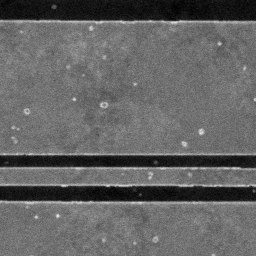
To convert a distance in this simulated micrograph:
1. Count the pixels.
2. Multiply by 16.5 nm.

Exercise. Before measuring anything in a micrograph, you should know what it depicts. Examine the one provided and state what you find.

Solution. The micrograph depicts lines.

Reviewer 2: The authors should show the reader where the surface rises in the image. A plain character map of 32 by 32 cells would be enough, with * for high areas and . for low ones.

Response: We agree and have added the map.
................................
................................
................................
********************************
********************************
********************************
********************************
********************************
********************************
********************************
********************************
********************************
********************************
********************************
********************************
********************************
********************************
********************************
********************************
................................
................................
********************************
********************************
................................
................................
********************************
********************************
********************************
********************************
********************************
********************************
********************************